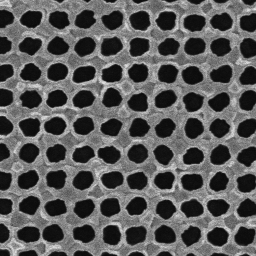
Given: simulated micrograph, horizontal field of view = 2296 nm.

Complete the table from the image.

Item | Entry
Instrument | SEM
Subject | a regular array of holes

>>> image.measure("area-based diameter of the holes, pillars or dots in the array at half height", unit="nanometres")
175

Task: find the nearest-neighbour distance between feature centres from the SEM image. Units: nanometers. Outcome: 231